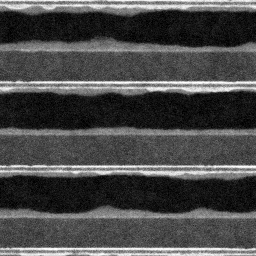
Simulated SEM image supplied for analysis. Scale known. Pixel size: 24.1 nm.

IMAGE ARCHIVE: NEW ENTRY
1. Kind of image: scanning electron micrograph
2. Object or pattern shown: lines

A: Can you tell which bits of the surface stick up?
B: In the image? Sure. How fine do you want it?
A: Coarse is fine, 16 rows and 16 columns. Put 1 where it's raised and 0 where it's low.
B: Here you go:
0100000001110000
0000000000000000
0000000000000000
1111111111111111
1111111111111111
1111111111111111
0000000000000000
0000000000000000
1111111111111111
1111111111111111
1111111111111111
0000000000000000
0000000000000000
1110001110001100
1111111111111111
1111111111111111